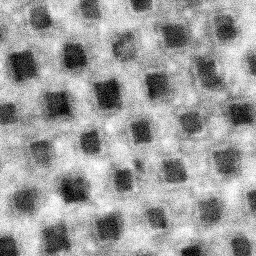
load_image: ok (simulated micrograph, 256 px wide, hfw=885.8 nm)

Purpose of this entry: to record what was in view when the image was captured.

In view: a regular array of raised bodies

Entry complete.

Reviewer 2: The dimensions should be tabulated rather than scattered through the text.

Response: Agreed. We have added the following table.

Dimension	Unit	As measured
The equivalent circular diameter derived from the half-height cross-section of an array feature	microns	0.103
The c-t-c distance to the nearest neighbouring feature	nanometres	173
